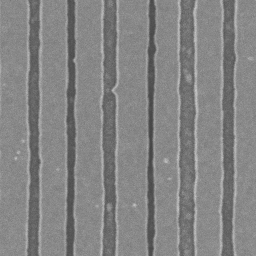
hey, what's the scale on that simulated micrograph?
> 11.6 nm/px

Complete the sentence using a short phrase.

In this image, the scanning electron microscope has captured parallel lines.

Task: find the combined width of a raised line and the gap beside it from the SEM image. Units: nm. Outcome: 451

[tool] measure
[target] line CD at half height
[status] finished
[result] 26.5 pixels